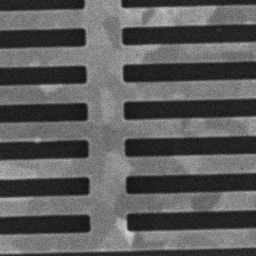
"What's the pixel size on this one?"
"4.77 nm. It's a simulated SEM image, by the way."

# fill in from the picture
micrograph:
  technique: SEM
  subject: groups of lines, slits or small figures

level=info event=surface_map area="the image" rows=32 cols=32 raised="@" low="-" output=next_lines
-----------@@@@-----------------
---@@@@@@@@@@@@@@@@@@@@@@@@@@@@@
@@@@@@@@@@@@@@@@@@@@@@@@@@@@@@@@
@@@@@@@---@@@@@-----------------
-----------@@@@-----------------
-----------@@@@-----------@@@@@@
@@@@@@@@@@@@@@@@@@@@@@@@@@@@@@@@
@@@@@@@@@@@@@@@@@@@@@@@@@@@@@@@-
-----------@@@@-----------------
-----------@@@@-----------------
----------@@@@@@@@@@@@@@@@@@@@@@
@@@@@@@@@@@@@@@@@@@@@@@@@@@@@@@@
@@@@@@@@@@@@@@@@@@@-------------
-----------@@@@-----------------
-----------@@@@-----------------
--@@@@@@@@@@@@@@@@@@@@@@@@@@@@@@
@@@@@@@@@@@@@@@@@@@@@@@@@@@@@@@@
@@@@@@@----@@@@@----------------
-----------@@@@-----------------
-----------@@@@@----------@@@@@@
@@@@@@@@@@@@@@@@@@@@@@@@@@@@@@@@
@@@@@@@@@@@@@@@@@@@@@@@@@@@@@@@-
-----------@@@@@----------------
-----------@@@@@----------------
-----------@@@@@@@@@@@@@@@@@@@@@
@@@@@@@@@@@@@@@@@@@@@@@@@@@@@@@@
@@@@@@@@@@@@@@@@@@@-------------
-----------@@@@@----------------
-----------@@@@@----------------
@@@@@@@@@@@@@@@@@@@@@@@@@@@@@@@@
@@@@@@@@@@@@@@@@@@@@@@@@@@@@@@@@
@@@-----------------------------